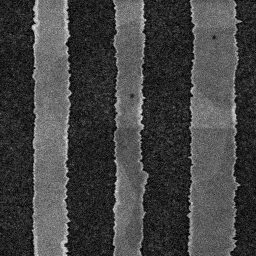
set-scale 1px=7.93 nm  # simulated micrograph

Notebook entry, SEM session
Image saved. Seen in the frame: one or a few lines or trenches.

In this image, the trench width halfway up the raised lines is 383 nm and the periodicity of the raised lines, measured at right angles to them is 644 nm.